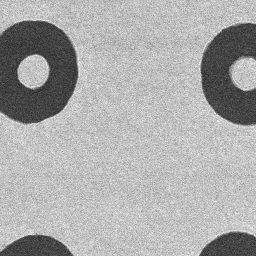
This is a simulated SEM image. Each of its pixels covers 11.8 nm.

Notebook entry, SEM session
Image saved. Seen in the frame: ring-shaped grooves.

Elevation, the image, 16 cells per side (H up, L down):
HHHHHHHHHHHHHHHH
HLLHHHHHHHHHHHHL
LLLLHHHHHHHHHLLL
LLLLLHHHHHHHHLLL
LHHLLHHHHHHHHLLH
LLLLLHHHHHHHHLLH
LLLLHHHHHHHHHLLL
HLLHHHHHHHHHHHLL
HHHHHHHHHHHHHHHH
HHHHHHHHHHHHHHHH
HHHHHHHHHHHHHHHH
HHHHHHHHHHHHHHHH
HHHHHHHHHHHHHHHH
HHHHHHHHHHHHHHHH
HHHHHHHHHHHHHHHH
LLLLHHHHHHHHHLLL